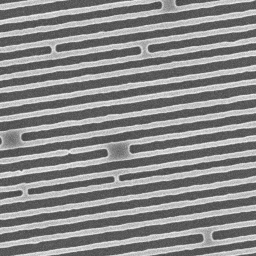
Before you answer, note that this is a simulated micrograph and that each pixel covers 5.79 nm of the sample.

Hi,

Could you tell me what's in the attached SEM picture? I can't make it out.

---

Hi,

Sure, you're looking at parallel lines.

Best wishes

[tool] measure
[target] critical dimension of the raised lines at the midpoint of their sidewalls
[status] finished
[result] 5.06 px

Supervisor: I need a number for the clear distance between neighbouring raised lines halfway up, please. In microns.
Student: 0.0487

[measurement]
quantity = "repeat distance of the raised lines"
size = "80.3 nm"